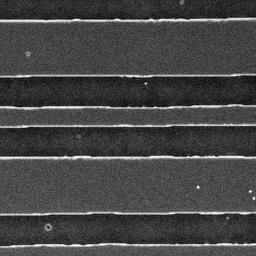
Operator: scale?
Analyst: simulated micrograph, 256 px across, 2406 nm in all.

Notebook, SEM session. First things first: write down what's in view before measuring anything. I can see lines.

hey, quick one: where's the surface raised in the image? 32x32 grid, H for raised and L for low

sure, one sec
LLLLLLLLLLLLLLLLLLLLLLLLLLLLLLLL
LLLLLLLLLLLLLLLLLLLLLLLLLLLLLLLL
LLLLLLLLLHLLLLHLLLHLHHHHHHHHHHHH
HHHHHHHHHHHHHHHHHHHHHHHHHHHHHHHH
HHHHHHHHHHHHHHHHHHHHHHHHHHHHHHHH
HHHHHHHHHHHHHHHHHHHHHHHHHHHHHHHH
HHHHHHHHHHHHHHHHHHHHHHHHHHHHHHHH
HHHHHHHHHHHHHHHHHHHHHHHHHHHHHHHH
HHHHHHHHHHHHHHHHHHHHHHHHHHHHHHHH
HHHHLLLLLLLLLLLHHHHLLLLLLLLLLLLL
LLLLLLLLLLLLLLLLLLLLLLLLLLLLLLLL
LLLLLLLLLLLLLLLLLLLLLLLLLLLLLLLL
LLLLLLLLLLLLLLLLLLLLLLLLLLLLLLLL
HHLLLHHHHHHHHHLLLLLLLHHHHHHHHHHH
HHHHHHHHHHHHHHHHHHHHHHHHHHHHHHHH
HHHHHHHHHHHHHHHHHHHHHHHHHHHHHHHH
LLLLLLLLLLLLLLLLLLLLLLLLLLLLLLLL
LLLLLLLLLLLLLLLLLLLLLLLLLLLLLLLL
LLLLLLLLLLLLLLLLLLLLLLLLLLLLLLLL
LLLLLLLLLLLLLLLLLLLLLLLLLLLLLLLL
HHHHHHHHHHHHHHHHHHHHHHHHHHHHHHHH
HHHHHHHHHHHHHHHHHHHHHHHHHHHHHHHH
HHHHHHHHHHHHHHHHHHHHHHHHHHHHHHHH
HHHHHHHHHHHHHHHHHHHHHHHHHHHHHHHH
HHHHHHHHHHHHHHHHHHHHHHHHHHHHHHHH
HHHHHHHHHHHHHHHHHHHHHHHHHHHHHHHH
HHHHHHHHHHHHHHHHHHHHHHHHHHHHHHHH
LLLLLLLLLLLLLLLLLLLLLLLLLLLLLLLL
LLLLLLLLLLLLLLLLLLLLLLLLLLLLLLLL
LLLLLLLLLLLLLLLLLLLLLLLLLLLLLLLL
LLLLLLLLLLLLLLLLLLLLLLLLLLLLLLLL
HHHHHHHHHHHHHHHHHHHHHHHHHHHHHHHH